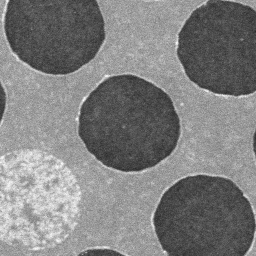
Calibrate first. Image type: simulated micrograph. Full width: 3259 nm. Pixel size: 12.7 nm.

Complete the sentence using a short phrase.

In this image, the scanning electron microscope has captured holes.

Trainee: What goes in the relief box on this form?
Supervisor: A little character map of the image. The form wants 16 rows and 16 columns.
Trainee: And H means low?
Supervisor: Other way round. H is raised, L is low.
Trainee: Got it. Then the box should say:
LLLLLLHHHHHHLLLL
LLLLLLLHHHHHLLLL
LLLLLLHHHHHLLLLL
HLLLLLHHHHHLLLLL
HHHLLHHHHHHHLLLL
HHHHHHLLLLHHHLLL
HHHHHLLLLLLHHHHH
HHHHHLLLLLLHHHHH
HHHHHLLLLLLHHHHH
HHHHHHLLLLLHHHHH
HHHHHHHLLHHHHHHH
HHHHHHHHHHHLLLLH
HHHHHHHHHHLLLLLH
HHHHHHHHHHLLLLLL
HHHHHHHHHHLLLLLL
HHHHHHHHHHLLLLLL